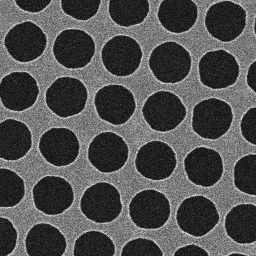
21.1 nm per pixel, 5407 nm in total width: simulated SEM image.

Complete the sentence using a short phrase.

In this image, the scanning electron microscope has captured a regular array of holes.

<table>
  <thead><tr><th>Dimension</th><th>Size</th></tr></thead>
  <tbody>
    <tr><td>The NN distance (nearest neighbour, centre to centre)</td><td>1.03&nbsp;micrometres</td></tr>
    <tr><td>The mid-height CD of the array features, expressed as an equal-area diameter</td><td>859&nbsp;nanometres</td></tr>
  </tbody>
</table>